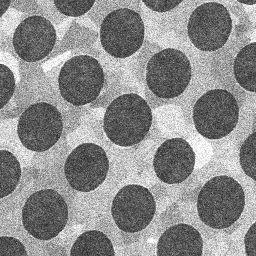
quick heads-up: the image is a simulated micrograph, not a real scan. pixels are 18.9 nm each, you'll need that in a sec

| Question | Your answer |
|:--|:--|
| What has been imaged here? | a regular array of holes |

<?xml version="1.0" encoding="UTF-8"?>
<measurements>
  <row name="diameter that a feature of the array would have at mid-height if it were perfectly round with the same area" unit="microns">0.912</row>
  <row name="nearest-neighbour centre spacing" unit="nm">1170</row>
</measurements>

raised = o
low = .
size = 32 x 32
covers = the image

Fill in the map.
.oooooo.....oooooo....ooo...oo..
.ooooooo...ooo...ooo.ooo.....ooo
ooo...ooooooo.....oooooo.....ooo
oo.....oooooo.....ooooo......ooo
oo.....ooooo......oooooo.....ooo
oo.....oooooo.....oooooo....ooo.
oo....ooooooo....ooo...ooooooo..
ooo..oooo...ooooooo.....ooooo...
.ooooooo.....ooooo......ooooo...
..ooooo......ooooo......ooooo...
..ooooo......ooooo......oooooo..
..ooooo......oooooo....ooo...oo.
.ooooooo....oo....ooooooo....ooo
ooo....oooooo......ooooo......oo
ooo.....ooooo......ooooo......oo
oo......ooooo......ooooo......oo
oo......ooooo......oooooo....ooo
oo.....ooooooo....ooo..oooooooo.
ooo...ooo....ooooooo....oooooo..
..oooooo.....oooooo.....oooooo..
...ooooo......ooooo.....oooooo..
...ooooo.....oooooo.....oooooo..
...ooooo.....ooooooo...ooo...ooo
..ooooooo...ooo...ooooooo.....oo
.ooo....oooooo.....oooooo......o
ooo.....oooooo.....oooooo......o
ooo......ooooo.....oooooo.....oo
ooo.....oooooo.....oooooo.....oo
ooo.....ooooooo...ooo...ooo.ooo.
.ooo...ooo...ooooooo.....oooooo.
...oooooo.....oooooo.....oooooo.
...oooooo.....oooooo.....oooooo.